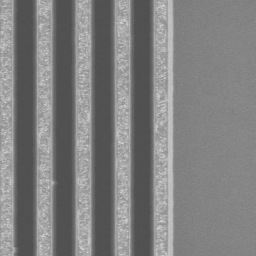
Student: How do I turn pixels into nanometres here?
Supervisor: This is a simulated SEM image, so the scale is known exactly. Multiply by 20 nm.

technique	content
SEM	parallel lines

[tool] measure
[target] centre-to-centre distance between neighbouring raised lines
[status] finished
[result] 780 nm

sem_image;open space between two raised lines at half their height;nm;410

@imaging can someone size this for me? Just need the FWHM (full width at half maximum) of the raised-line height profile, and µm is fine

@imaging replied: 0.375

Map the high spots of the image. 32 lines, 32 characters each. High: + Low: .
++..+++..++...++...++...........
++..+++..++...++...++...........
++..+++..++...++...++...........
++..+++..++...++...++...........
++..+++..++...++...++...........
++..+++..++...++...++...........
++..+++..++...++...++...........
++..+++..++...++...++...........
++..+++..++...++...++...........
++..+++..++...++...++...........
++..+++..++...++...++...........
++..+++..++...++...++...........
++..+++..++...++...++...........
++..+++..++...++...++...........
++..+++..++...++...++...........
++..+++..++...++...++...........
++..+++..++...++...++...........
++..+++..++...++...++...........
++..+++..++...++...++...........
++..+++..++...++...++...........
++..+++..++...++...++...........
++..+++..++...++...++...........
++..+++..++...++...++...........
++..+++..++...++...++...........
++..+++..++...++...++...........
++..+++..++...++...++...........
++..+++..++...++...++...........
++..+++..++...++...++...........
++..+++..++...++...++...........
++..+++..++...++...++...........
++..+++..++...++...++...........
++..+++..+++..++...++...........